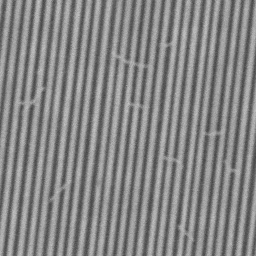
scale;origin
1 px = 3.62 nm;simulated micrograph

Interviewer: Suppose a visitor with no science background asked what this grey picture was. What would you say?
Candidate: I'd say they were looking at parallel lines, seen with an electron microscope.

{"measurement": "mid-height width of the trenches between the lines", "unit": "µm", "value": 0.0175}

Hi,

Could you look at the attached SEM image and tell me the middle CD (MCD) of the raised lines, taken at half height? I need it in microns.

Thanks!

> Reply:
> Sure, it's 0.018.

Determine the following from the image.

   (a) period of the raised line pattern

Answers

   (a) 35.8 nm